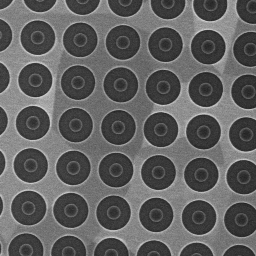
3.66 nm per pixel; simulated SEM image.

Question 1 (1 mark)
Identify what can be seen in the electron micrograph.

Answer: an array of small figures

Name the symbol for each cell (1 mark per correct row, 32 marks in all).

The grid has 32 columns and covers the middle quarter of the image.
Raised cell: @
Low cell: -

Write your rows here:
@@---@@@@@@@@@@@@@@@@@@@@@@@@@@@
@-----@@@@@@-----@@@@@@@--@@@@@@
-------@@@@-------@@@@------@@@@
--------@@--------@@@--------@@@
--------@@---------@@--------@@-
--------@@---------@---------@@-
-------@@@--------@@---------@@-
-------@@@--------@@@--------@@-
@-----@@@@@------@@@@-------@@@@
@@@@@@@@@@@@@--@@@@@@@-----@@@@@
@@@@@@@@@@@@@@@@@@@@@@@@@@@@@@@@
@----@@@@@@@@-@@@@@@@@@@@@@@@@@@
------@@@@@-----@@@@@@----@@@@@@
-------@@@-------@@@@-------@@@@
-------@@---------@@--------@@@-
-------@@---------@@---------@@-
-------@@---------@@---------@--
-------@@@--------@@---------@--
------@@@@-------@@@--------@@@-
@@--@@@@@@@-----@@@@@------@@@@-
@@@@@@@@@@@@@@@@@@@@@@@---@@@@@@
@@@@@@@@@@@@@@@@@@@@@@@@@@@@@@@@
-----@@@@@@----@@@@@@@@@@@@@@@@@
------@@@@------@@@@@-----@@@@@@
------@@@--------@@@-------@@@@-
-------@@--------@@@--------@@@-
-------@---------@@---------@@--
------@@@--------@@---------@@--
------@@@--------@@---------@@--
-----@@@@@------@@@@-------@@@--
@@@@@@@@@@@----@@@@@@-----@@@@@-
@@@@@@@@@@@@@@@@@@@@@@@-@@@@@@@@